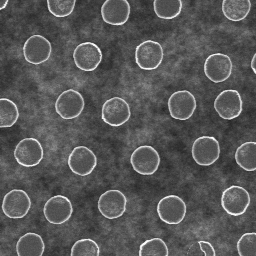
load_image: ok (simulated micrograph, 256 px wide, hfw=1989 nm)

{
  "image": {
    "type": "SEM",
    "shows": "a regular array of raised bodies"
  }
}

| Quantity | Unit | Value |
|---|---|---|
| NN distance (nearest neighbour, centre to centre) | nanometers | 395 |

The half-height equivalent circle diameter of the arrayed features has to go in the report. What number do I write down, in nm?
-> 217